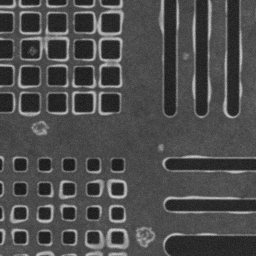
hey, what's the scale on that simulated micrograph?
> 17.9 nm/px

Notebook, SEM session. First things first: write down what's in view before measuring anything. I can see groups of lines, slits or small figures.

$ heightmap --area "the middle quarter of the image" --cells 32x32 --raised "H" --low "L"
HHHLLLLHHHLLLLHHHHHHHHHHHLLLHHHH
LHLLLLLHHLLLLLHHHHHHHHHHHLLLHHHH
LHLLLLLHHLLLLLHHHHHHHHHHHLLLHHHH
LHLLLLLLHLLLLLHHHHHHHHHHHLLLHHHH
LHLLLLLLHLLLLLHHHHHHHHHHHLLLHHHH
HHHLLLLHHHLLLLHHHHHHHHHHHLLLHHHH
HHHHHHHHHHHHHHHHHHHHHHHHHLLLHHHH
LHLLLLLHHLLLLLHHHHHHHHHHHLLLHHHH
LHLLLLLLHLLLLLHHHHHHHHHHHLLLHHHH
LHLLLLLLHLLLLLHHHHHHHHHHHLLLHHHH
LHLLLLLLHLLLLLHHHHHHHHHHHLLLHHHH
LHLLLLLLHLLLLLHHHHHHHHHHHLLLHHHH
HHHLHHHHHHLHHHHHHHHHHHHHHLLLHHHH
HHHHHHHHHHHHHHHHHHHHHHHHHHHHHHHH
HHHHHHHHHHHHHHHHHHHHHHHHHHHHHHHH
HHHHHHHHHHHHHHHHHHHHHHHHHHHHHHHH
HHHHHHHHHHHHHHHHHHHHHHHHHHHHHHHH
HHHHHHHHHHHHHHHHHHHHHHHHHHHHHHHH
HHHHHHHHHHHHHHHHHHHHHHHHHHHHHHHH
HHHHHHHHHHHHHHHHHHHHHHHHHHHHHHHH
HHHHHHHHHHHHHHHHHHHHHHHHHHHHHHHH
HHHHHHHHHHHHHHHHHHHHHHHHHHHHHHHH
HHHHHHHHHHHHHHHHHHHHHHHHHHHHHHHH
LLHHHHLLHHHHLLHHHHHHHHHHHHLLLLLL
LLLHHHLLLHHHLLLHHHHHHHHHHLLLLLLL
LLLHHLLLLHHHLLLHHHHHHHHHHLLLLLLL
LLLHHHLLLHHHLLLHHHHHHHHHHHLLLLLL
HHHHHHHHHHHHHHHHHHHHHHHHHHHHHHHH
HHHHHHHHHHHHHHHHHHHHHHHHHHHHHHHH
LHHHHHHLLHHLLLLHHHHHHHHHHHHHHHHH
LLLHHHLLLLHLLLLHHHHHHHHHHHHHHHHH
LLLHHLLLLHHLLLLHHHHHHHHHHHHHHHHH